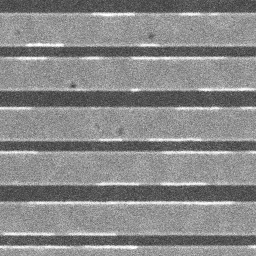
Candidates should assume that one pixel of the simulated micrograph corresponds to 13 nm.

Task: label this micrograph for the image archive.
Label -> parallel lines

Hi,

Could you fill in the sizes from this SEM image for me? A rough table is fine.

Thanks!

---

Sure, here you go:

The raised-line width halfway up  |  422 nanometres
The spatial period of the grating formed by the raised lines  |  0.613 microns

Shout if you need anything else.